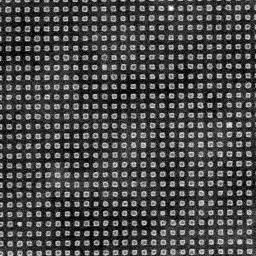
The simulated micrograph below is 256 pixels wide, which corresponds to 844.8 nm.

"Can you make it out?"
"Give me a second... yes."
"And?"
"a regular array of raised bodies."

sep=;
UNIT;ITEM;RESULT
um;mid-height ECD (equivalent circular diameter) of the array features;0.0167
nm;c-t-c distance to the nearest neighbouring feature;31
